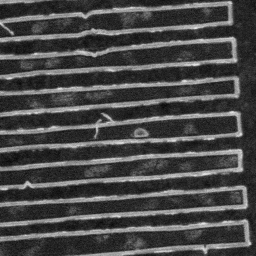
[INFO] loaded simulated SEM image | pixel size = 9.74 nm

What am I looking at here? parallel lines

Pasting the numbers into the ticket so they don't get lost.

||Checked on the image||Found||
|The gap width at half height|177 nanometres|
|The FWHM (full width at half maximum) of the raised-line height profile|185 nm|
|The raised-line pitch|355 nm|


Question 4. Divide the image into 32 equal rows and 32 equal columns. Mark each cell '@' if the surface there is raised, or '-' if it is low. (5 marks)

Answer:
@@@@@@@@@@@@@@@@@@@@@@@@@@@@@@@@
@@@@@@@@@@@@@----------------@@@
@@---------------------------@@@
---------------------@@@@@@@@@@@
-------@@@@@@@@@@@@@@@@@@@@@@@@@
@@@@@@@@@@@@@@@@@@@@@@-------@@@
@@@@@@@@@@@@@----------------@@@
-----------------------------@@@
---------------@@@@@@@@@@@@@@@@@
-@@@@@@@@@@@@@@@@@@@@@@@@@@@@@@@
@@@@@@@@@@@@@@@@@@@@@@-------@@@
@@@@@@------------------------@@
---------------------@@@@@@@@@@@
----------@@@@@@@@@@@@@@@@@@@@@@
@@@@@@@@@@@@@@@@@@@@@@@@@-----@@
@@@@@@@@@@@@@@----------------@@
@@@@-------------@------------@@
-----------------@-@-@@@@@@@@@@@
---@@@@@@@@@@@@@@@@@@@@@@@@@@@@@
@@@@@@@@@@@@@@@@@@@@@---------@@
@@@@@@@-----------------------@@
---------------------------@@@@@
-------------@@@@@@@@@@@@@@@@@@@
@@@@@@@@@@@@@@@@@@@@@@@@@@@@@@@@
@@@@@@@@@@@@@@@@@--------------@
@@@---------------------------@@
---------------------@@@@@@@@@@@
-------@@@@@@@@@@@@@@@@@@@@@@@@@
@@@@@@@@@@@@@@@@@@@@@@---------@
@@@@---------------------------@
------------------------------@@
-----------------@@@@@@@@@@@@@@@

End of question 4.